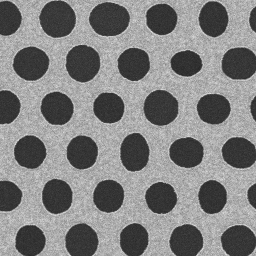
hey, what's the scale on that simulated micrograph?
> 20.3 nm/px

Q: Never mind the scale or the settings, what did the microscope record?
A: a regular array of holes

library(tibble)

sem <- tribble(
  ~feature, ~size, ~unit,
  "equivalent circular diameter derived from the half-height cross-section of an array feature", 670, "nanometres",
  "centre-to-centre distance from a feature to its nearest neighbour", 1.03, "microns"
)